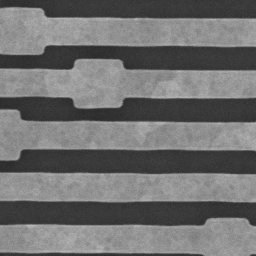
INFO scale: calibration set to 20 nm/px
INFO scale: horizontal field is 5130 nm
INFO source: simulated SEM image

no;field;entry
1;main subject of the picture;wiring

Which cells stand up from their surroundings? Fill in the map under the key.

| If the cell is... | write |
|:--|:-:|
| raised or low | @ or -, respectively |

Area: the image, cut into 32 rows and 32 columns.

--------------------------------
@@@@@---------------------------
@@@@@@@@@@@@@@@@@@@@@@@@@@@@@@@@
@@@@@@@@@@@@@@@@@@@@@@@@@@@@@@@@
@@@@@@@@@@@@@@@@@@@@@@@@@@@@@@@@
@@@@@@@@@@@@@@@@@@@@@@@@@@@@@@@@
@@@@@---------------------------
----------@@@@@-----------------
---------@@@@@@@----------------
@@@@@@@@@@@@@@@@@@@@@@@@@@@@@@@@
@@@@@@@@@@@@@@@@@@@@@@@@@@@@@@@@
@@@@@@@@@@@@@@@@@@@@@@@@@@@@@@@@
---------@@@@@@-----------------
----------@@@-------------------
@@@-----------------------------
@@@@@@@@@@@@@@@@@@@@@@@@@@@@@@@@
@@@@@@@@@@@@@@@@@@@@@@@@@@@@@@@@
@@@@@@@@@@@@@@@@@@@@@@@@@@@@@@@@
@@@@@@@@@@@@@@@@@@@@@@@@@@@@@@@@
@@------------------------------
--------------------------------
--------------------------------
@@@@@@@@@@@@@@@@@@@@@@@@@@@@@@@@
@@@@@@@@@@@@@@@@@@@@@@@@@@@@@@@@
@@@@@@@@@@@@@@@@@@@@@@@@@@@@@@@@
--------------------------------
--------------------------------
--------------------------@@@@@-
@@@@@@@@@@@@@@@@@@@@@@@@@@@@@@@@
@@@@@@@@@@@@@@@@@@@@@@@@@@@@@@@@
@@@@@@@@@@@@@@@@@@@@@@@@@@@@@@@@
--@@@@-@@@@@@@@@@@@@@@@@@@@@@@@@